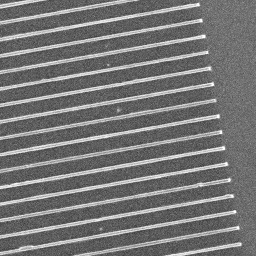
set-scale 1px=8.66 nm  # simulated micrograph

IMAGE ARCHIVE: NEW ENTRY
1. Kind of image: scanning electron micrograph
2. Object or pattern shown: parallel lines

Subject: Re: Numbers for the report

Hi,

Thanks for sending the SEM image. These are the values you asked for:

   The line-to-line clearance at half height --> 0.119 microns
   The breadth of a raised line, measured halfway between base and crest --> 0.0235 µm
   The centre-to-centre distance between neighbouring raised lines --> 140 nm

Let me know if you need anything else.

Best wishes